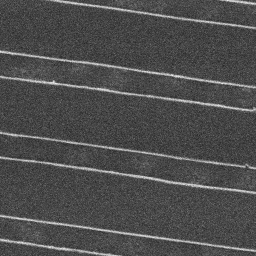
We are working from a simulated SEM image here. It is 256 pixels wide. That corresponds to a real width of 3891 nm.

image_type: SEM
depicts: one or a few lines or trenches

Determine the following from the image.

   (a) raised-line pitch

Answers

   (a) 1240 nm